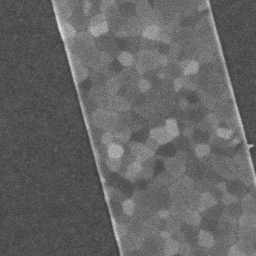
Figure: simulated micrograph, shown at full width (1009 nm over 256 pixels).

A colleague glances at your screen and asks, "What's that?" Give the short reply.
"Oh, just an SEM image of one or a few lines or trenches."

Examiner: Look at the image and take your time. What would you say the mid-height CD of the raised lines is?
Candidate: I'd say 593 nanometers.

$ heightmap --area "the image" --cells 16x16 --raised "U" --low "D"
DDDUUUUUUUUUUDDD
DDDDUUUUUUUUUDDD
DDDDUUUUUUUUUUDD
DDDDUUUUUUUUUUDD
DDDDUUUUUUUUUUDD
DDDDDUUUUUUUUUDD
DDDDDUUUUUUUUUUD
DDDDDUUUUUUUUUUD
DDDDDDUUUUUUUUUD
DDDDDDUUUUUUUUUU
DDDDDDUUUUUUUUUU
DDDDDDUUUUUUUUUU
DDDDDDDUUUUUUUUU
DDDDDDDUUUUUUUUU
DDDDDDDUUUUUUUUU
DDDDDDDUUUUUUUUU